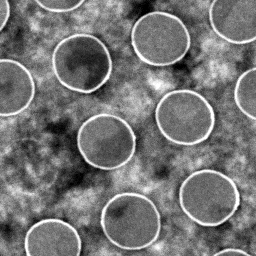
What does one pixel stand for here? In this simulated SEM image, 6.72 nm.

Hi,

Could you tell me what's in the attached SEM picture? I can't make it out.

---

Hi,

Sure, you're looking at raised bodies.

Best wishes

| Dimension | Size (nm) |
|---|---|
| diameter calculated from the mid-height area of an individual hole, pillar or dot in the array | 375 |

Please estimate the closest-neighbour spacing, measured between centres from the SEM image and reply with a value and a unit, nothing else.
0.55 um